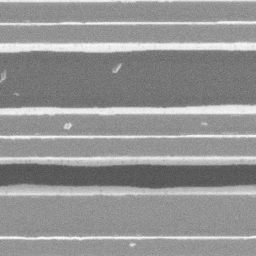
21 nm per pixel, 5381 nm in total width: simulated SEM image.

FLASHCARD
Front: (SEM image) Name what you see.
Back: lines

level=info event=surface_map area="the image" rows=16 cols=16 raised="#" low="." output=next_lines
################
################
################
................
................
................
................
################
################
################
................
................
################
################
################
################